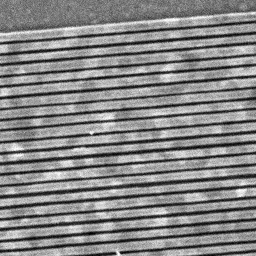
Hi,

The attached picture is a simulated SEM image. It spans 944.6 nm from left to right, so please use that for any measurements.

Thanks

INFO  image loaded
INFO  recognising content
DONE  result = parallel lines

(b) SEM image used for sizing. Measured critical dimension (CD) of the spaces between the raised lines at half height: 3.5 px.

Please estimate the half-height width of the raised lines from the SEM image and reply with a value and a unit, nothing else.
25.7 nm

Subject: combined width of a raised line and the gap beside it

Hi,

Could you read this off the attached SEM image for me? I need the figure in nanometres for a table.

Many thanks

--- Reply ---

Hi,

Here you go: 40.3